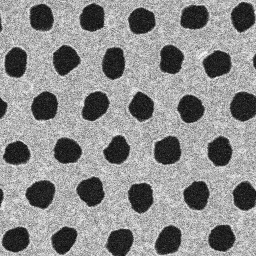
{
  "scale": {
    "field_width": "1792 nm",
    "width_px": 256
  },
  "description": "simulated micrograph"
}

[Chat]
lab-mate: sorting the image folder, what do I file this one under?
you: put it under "a regular array of holes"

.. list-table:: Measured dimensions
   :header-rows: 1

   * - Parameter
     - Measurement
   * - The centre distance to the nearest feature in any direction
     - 337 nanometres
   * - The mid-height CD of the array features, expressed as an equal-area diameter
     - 188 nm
